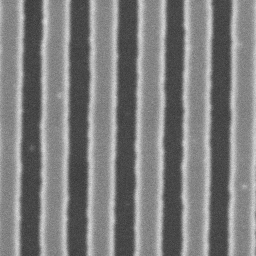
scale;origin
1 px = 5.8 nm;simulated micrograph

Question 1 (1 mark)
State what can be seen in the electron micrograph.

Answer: lines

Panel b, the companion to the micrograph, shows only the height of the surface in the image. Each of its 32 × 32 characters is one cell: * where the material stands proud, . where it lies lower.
***..****..****..****..***...***
***..****..****..****..***...***
***..****..****..****..***...***
***..****..****..****..***...***
***..****..***...****..***...***
***..****..***...****..***...***
***..***...****..****..***...***
***..***...****..****..***...***
***..***...***...****..***...***
***..***...***...****..***...***
***..***...***...****..***...***
***..***...***...****..***...***
***..***...***...****..***...***
***..***...***...****..***...***
***..***...***...***...***...***
***..***...***...***...***...***
***..***...***...***...***...***
***..***...***...***...***...***
**...***...***...***...***...***
**...***...***...***...***...***
***..***...***...***...***...***
***..***...***...***...***...***
**...***...***...***...***...***
**...***...***...***...***...***
**...***...***...***...***...***
**...***...***...***...***...***
**...***...***...***...***...***
**...***...***...***...***...***
**...***...***...***...***...***
**...***...***...***...***...***
**...***...***...***...***...***
**...***...***...***...***...***